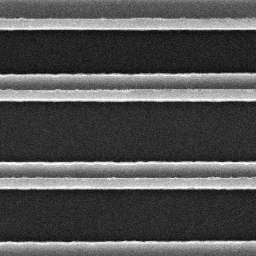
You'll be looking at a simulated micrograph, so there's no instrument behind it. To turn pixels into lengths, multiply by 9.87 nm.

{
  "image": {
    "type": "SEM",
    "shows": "lines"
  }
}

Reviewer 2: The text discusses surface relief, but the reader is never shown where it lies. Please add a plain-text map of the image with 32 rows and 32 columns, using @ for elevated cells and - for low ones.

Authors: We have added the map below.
@@@@@@@@@@@@@@@@@@@@@@@@@@@@@@@@
@@@@@@@@@@@@@@@@@@@@@@@@@@@@@@@@
@@@@@@@@@@@@@@@@@@@@@@@@@@@@@@@@
@@@@@@@@@@@@@@@@@@@@@@@@@@@@@@@@
--------------------------------
--------------------------------
--------------------------------
--------------------------------
--------------------------------
----@----@@-@@@--@@@@@@@@@@@@@@@
@@@@@@@@@@@@@@@@@@@@@@@@@@@@@@@@
@@@@@@@@@@@@@@@@@@@@@@@@@@@@@@@@
--------------------------------
--------------------------------
--------------------------------
--------------------------------
--------------------------------
--------------------------------
--------------------------------
--------------------------------
@@@@@@@@@@@@@@@@@@@@@@@@@@@@@@@@
@@@@@@@@@@@@@@@@@@@@@@@@@@@@@@@@
@@@@@@@@@@@@@@@@@@@@@@@@@@@@@@@@
--------------------------------
--------------------------------
--------------------------------
--------------------------------
--------------------------------
--------------------------------
--------------------------------
@@@@@@@@@@@@@@@@@@@@@@@@@@@@@@@@
@@@@@@@@@@@@@@@@@@@@@@@@@@@@@@@@